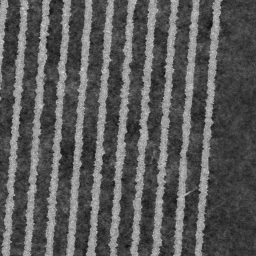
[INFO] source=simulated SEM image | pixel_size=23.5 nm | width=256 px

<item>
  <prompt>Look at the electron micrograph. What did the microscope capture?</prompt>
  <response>parallel lines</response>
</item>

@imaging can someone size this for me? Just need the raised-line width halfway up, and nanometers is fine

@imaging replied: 150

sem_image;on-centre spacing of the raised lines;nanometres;502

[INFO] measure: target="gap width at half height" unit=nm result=355